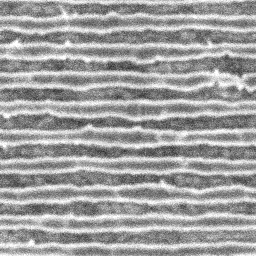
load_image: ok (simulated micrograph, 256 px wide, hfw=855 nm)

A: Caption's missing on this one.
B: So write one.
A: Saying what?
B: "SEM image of parallel lines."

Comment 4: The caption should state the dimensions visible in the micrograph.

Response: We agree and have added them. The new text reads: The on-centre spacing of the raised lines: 28.5 px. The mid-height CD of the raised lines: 50.1 nm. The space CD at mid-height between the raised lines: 47.2 nm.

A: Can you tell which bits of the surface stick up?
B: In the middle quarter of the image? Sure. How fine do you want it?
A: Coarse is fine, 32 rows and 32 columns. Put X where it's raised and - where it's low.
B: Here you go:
--------------------------------
--------------------------------
XXXXXXXXXXXXXXXXXXXX-XX--------X
XXXXXXXXXXXXXXXXXXXXXXXXXXXXXXXX
XXXXXXXXXXXXXXXXXXXXXXXXXXXXXXXX
XXXXXXXXXX------XXXXXXXXXXXXXXXX
------------------------------X-
--------------------------------
--------------------------------
-XXX----XXXXXXXXXXXXXXXXXXXXXXXX
XXXXXXXXXXXXXXXXXXXXXXXXXXXXXXXX
XXXXXXXXXXXXXXXXXXXXXXXXXXXXXXXX
XXXXXXXXXXXXXXXXXXXXXXXXXXXXXXXX
----------------XXXXXXXXX-------
--------------------------------
------X-------------------------
----XXXXXXXXXXX--XXX------------
XXXXXXXXXXXXXXXXXXXXXXXXXXXXXXXX
XXXXXXXXXXXXXXXXXXXXXXXXXXXXXXXX
XXXXXXXXXXXXXXXXXXXXXXXXXXXXXXXX
----------XXX-XXXXXXXXXX--------
--------------------------------
--------------------------------
X-X--X-------------------XXXXX--
XXXXXXXXXXXXXXXXXXXXXXXXXXXXXXXX
XXXXXXXXXXXXXXXXXXXXXXXXXXXXXXXX
XXXX---XXXXXXXXXXXXXXXXXXXXXXXXX
-----------------X-----X--------
--------------------------------
------------------------X-------
XX-----XX-----XXXXXXXXXXXXX-----
XXXXXXXXXXXXXXXXXXXXXXXXXXXXXXXX